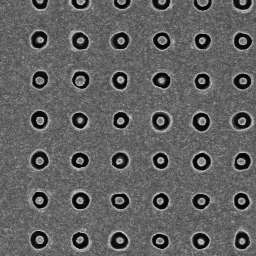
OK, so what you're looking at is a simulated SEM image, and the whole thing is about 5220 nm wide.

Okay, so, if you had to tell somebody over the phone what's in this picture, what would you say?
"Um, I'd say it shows a regular array of ring-shaped grooves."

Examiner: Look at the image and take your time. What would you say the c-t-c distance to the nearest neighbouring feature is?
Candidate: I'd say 805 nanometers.